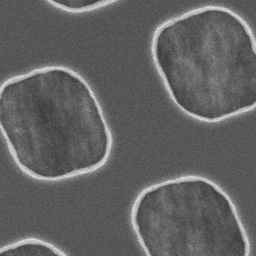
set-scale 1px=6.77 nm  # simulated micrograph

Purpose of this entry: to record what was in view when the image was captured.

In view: holes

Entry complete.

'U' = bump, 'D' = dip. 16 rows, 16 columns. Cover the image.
UUUUDUUUUUUUUUUU
UUUUUUUUUUUDDDDU
UUUUUUUUUUDDDDDD
UUUUUUUUUUDDDDDD
UUDDUUUUUUDDDDDD
DDDDDUUUUUUDDDDD
DDDDDDUUUUUDDDDD
DDDDDDUUUUUUUUUU
DDDDDDDUUUUUUUUU
UDDDDDDUUUUUUUUU
UUDDDDUUUUUUUUUU
UUUUUUUUUUDDDUUU
UUUUUUUUUDDDDDUU
UUUUUUUUDDDDDDDU
UUUUUUUUUDDDDDDU
UDDUUUUUUDDDDDDU